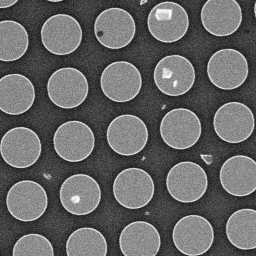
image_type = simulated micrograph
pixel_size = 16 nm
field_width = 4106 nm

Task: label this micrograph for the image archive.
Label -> an array of small figures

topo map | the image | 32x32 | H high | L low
HHLLLLLLLLLLLLLLLLLLHHLLLLHHHHLL
LLLLLLLLLLLLLHHHLLLHHHHLLHHHHHLL
LLLLLLHHHLLLHHHHHLLHHHHHLHHHHHLL
HHHLLHHHHHLLHHHHHLLHHHHLLLHHHHLL
HHHLLHHHHHLLHHHHHLLHHHHLLLLLLLLL
HHHLLHHHHHLLLHHHLLLLLLLLLLLLLLLL
HHHLLLHHHLLLLLLLLLLLLLLLLLLHHHLL
HHLLLLLLLLLLLLLLLLLLHHHLLLHHHHHL
LLLLLLLLLLLLLHHHHLLHHHHHLLHHHHHL
LHHLLLHHHHLLLHHHHHLHHHHHLLHHHHHL
HHHHLLHHHHHLLHHHHHLLHHHHLLLHHHLL
HHHHLLHHHHHLLHHHHLLLHHHLLLLLLLLL
HHHHLLHHHHLLLLHHLLLLLLLLLLLLLLLL
HHHHLLLLHLLLLLLLLLLLLLLLLLLLHHHL
LLLLLLLLLLLLLLLHHLLLLHHHLLLHHHHH
LLLLLLLLHHHLLLHHHHLLHHHHHLLHHHHH
LHHHLLLHHHHLLHHHHHLLHHHHHLLHHHHL
HHHHHLLHHHHHLHHHHHLLLHHHHLLLHHLL
HHHHHLLHHHHHLLHHHHLLLLHLLLLLLLLL
HHHHHLLLHHHLLLLLLLLLLLLLLLLLLLLL
LHHHLLLLLLLLLLLLLLLLLLHHLLLLHHHH
LLLLLLLLLLLLLLLHHHLLLHHHHHLLHHHH
LLLLLLLLHHHHLLHHHHHLLHHHHHLLHHHH
LHHHHLLLHHHHLLHHHHHLLHHHHHLLHHHH
LHHHHHLLHHHHHLHHHHHLLLHHHLLLLLLL
LHHHHHLLHHHHLLLHHHLLLLLLLLLLLLLL
LHHHHLLLLHHLLLLLLLLLLLLLLLLLLLHH
LLLHLLLLLLLLLLLLLLLLLLLHHHLLLHHH
LLLLLLLLLLLLLLLLHHHLLLHHHHHLHHHH
LLLHHLLLLHHHHLLHHHHHLLHHHHHLHHHH
LLHHHHLLHHHHHLLHHHHHLLHHHHLLLHHH
LLHHHHHLHHHHHLLHHHHHLLLHHHLLLLLL